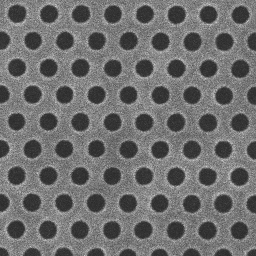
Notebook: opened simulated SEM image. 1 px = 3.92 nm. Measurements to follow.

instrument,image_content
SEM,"a regular array of holes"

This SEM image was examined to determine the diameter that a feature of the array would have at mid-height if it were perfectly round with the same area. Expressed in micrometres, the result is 0.0716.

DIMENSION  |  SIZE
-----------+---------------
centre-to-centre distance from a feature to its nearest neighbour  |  0.122 micrometres